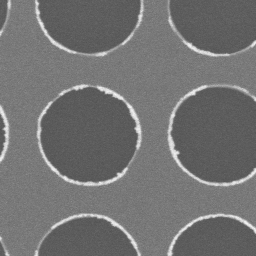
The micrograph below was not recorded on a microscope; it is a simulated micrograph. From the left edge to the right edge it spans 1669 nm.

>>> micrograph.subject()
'holes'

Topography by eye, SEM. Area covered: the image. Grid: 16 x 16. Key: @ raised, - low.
@@-------@@-----
@@@------@@-----
@@@-----@@@@----
@@@@@@@@@@@@@@@@
@@@@@@@@@@@@@@@@
@@@@@-@@@@@@@--@
@@@-----@@@-----
@@@-----@@@-----
@@@------@@-----
@@@-----@@@-----
@@@-----@@@@----
@@@@@@@@@@@@@@@@
@@@@@@@@@@@@@@@@
@@@@@@@@@@@@@@@@
@@@-----@@@-----
@@------@@@-----